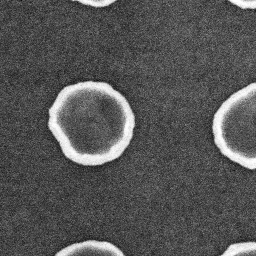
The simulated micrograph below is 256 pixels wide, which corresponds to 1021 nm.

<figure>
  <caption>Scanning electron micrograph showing raised bodies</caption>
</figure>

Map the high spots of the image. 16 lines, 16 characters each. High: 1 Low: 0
0000000000000000
0000000000000000
0000000000000000
0000000000000000
0000000000000000
0000111000000000
0001111100000011
0001111100000011
0000111100000011
0000111000000011
0000000000000000
0000000000000000
0000000000000000
0000000000000000
0000000000000000
0000111000000001